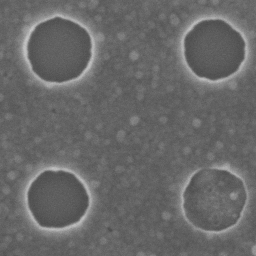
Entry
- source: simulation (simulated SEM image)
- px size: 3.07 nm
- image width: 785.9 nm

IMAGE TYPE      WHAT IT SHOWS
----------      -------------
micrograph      holes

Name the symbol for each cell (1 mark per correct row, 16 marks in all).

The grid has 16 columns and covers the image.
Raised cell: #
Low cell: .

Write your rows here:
################
##...#######..##
##....######...#
##....######...#
##...#######...#
################
################
################
################
################
################
##...###########
##....##########
##...###########
################
################